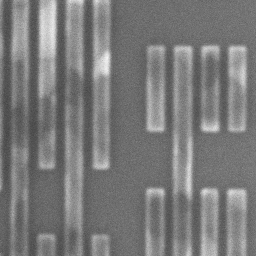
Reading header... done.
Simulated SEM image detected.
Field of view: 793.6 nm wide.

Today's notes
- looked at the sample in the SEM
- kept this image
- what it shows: wiring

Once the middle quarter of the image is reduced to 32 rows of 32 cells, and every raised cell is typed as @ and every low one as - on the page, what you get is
-@@@----@@@----------@@@@---@@@@
-@@@@---@@@----------@@@@---@@@@
-@@@@---@@@----------@@@@---@@@@
-@@@@---@@@----------@@@@---@@@@
-@@@@--@@@@----------@@@@---@@@@
-@@@@--@@@@----------@@@@---@@@@
-@@@@--@@@@----------@@@@---@@@@
-@@@@--@@@@----------@@@@---@@-@
-@@@@--@@@@----------@@@@---@@@@
-@@@---@@@@----------@@@@---@@@@
-@@@---@@@@----------@@@@---@@@@
-@@@---@@@@----------@@@@---@@@@
-@@@----@@@----------@@@@---@@@@
-@@@----@@@----------@@@@---@@@@
-@@@----@@@----------@@@@---@@@@
-@@@----@@@----------@@@@---@@@@
-@@@----@@@----------@@@@---@@@@
-@@@----@@@-----------------@@@@
-@@@----@@@-----------------@--@
-@@@----@@@--------------------@
-@@@----@@@--------------------@
-@@@----@@@---------------------
-@@@----@@@---------------------
-@@@---@@@@---------------------
-@@@---@@@@-----------------@--@
-@@@---@@@@-----------------@--@
-@@@------------------------@@--
-@@@------------------------@@--
-@@@------------------------@@--
-@@@------------------------@@--
-@@@------------------------@---
-@@@-----------------@@@@---@--@